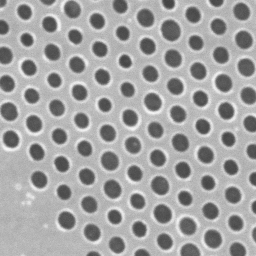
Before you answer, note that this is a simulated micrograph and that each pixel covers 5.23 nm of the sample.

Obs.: a regular array of holes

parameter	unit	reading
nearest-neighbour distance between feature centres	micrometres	0.144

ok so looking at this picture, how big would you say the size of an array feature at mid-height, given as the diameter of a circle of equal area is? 17.5 px